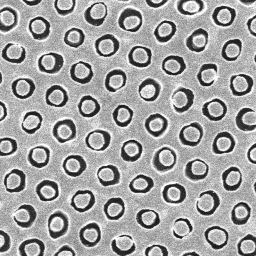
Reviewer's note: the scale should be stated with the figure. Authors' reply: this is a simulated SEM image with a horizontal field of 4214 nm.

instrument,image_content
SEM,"a regular array of ring-shaped grooves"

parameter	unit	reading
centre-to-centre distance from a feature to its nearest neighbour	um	0.535